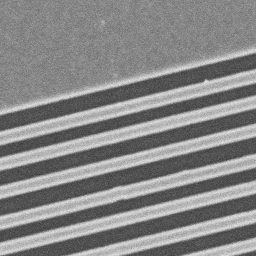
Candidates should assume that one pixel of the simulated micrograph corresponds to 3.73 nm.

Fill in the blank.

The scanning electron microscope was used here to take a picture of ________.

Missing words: parallel lines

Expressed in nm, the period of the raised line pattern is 101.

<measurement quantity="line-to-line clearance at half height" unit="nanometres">62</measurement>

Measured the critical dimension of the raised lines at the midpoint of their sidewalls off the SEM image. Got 42.1 nanometers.